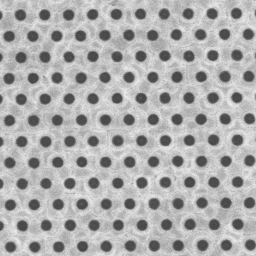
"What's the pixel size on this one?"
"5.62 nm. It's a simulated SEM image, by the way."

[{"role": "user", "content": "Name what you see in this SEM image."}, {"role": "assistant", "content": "a regular array of holes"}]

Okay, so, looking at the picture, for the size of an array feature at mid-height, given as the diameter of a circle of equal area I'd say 60.5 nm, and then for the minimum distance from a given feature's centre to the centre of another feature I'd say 133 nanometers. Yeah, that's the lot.